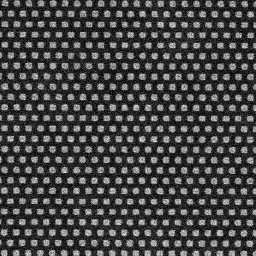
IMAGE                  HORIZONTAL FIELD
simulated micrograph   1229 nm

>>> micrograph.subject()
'a regular array of raised bodies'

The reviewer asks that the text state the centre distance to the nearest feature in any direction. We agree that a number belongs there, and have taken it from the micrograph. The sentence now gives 56 nanometres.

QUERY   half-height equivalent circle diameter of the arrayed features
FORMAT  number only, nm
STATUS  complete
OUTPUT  31.1